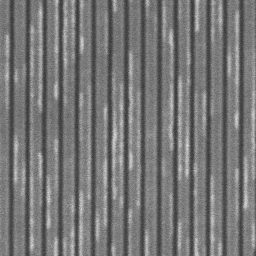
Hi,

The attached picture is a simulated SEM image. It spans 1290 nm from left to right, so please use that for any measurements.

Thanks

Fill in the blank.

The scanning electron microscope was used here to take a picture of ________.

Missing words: parallel lines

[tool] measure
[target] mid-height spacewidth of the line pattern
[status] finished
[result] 28.3 nanometers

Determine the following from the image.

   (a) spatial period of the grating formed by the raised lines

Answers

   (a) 82.7 nm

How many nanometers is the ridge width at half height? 51.7